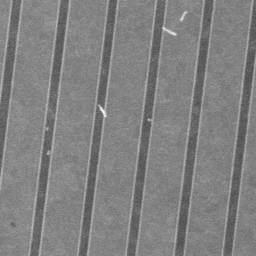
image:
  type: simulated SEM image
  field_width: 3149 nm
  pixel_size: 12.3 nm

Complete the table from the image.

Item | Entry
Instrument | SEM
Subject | parallel lines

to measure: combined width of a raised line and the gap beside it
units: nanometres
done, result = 588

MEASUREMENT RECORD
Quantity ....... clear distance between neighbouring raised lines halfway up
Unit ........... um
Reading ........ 0.124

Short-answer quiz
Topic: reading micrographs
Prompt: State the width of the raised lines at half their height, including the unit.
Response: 464 nm